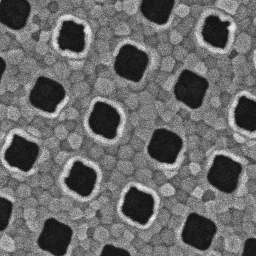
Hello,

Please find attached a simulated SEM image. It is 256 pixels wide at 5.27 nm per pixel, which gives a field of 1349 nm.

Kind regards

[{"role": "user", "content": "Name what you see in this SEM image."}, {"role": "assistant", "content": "a regular array of holes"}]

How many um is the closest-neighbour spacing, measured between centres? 0.332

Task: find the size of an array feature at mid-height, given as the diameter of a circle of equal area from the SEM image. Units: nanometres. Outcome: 178